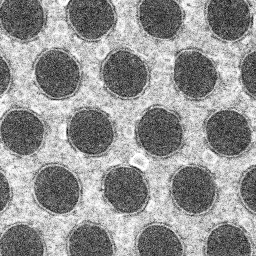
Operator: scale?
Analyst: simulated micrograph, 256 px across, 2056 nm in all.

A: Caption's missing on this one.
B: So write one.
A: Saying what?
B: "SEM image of a regular array of raised bodies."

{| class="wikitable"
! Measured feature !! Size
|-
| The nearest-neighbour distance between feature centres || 537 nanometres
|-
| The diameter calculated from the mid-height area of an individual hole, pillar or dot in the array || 382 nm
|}